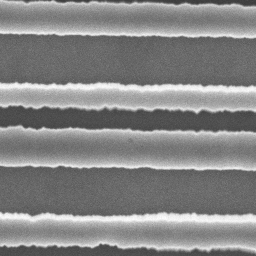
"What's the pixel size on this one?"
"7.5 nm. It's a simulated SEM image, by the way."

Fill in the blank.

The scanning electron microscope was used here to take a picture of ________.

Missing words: lines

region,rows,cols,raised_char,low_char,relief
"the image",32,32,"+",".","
+++++++++++++++++++++..+........
++++++++++++++++++++++++++++++++
++++++++++++++++++++++++++++++++
++++++++++++++++++++++++++++++++
....................++++++++++++
................................
................................
................................
................................
................................
................................
++++++++++++++++++++++++++++++++
++++++++++++++++++++++++++++++++
....+.....+++..+++++++++++++++++
................................
................................
++++++++++++++++++.++.+..+....+.
++++++++++++++++++++++++++++++++
++++++++++++++++++++++++++++++++
++++++++++++++++++++++++++++++++
++++++++++++++++++++++++++++++++
................................
................................
................................
................................
................................
................................
++++++++++++++++++++++++++++++++
++++++++++++++++++++++++++++++++
++++++++++++++++++++++++++++++++
+++++++++++++.++++++++++++++++++
................................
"